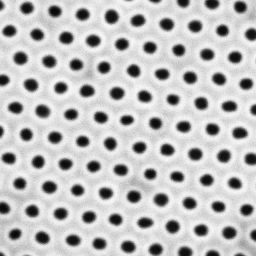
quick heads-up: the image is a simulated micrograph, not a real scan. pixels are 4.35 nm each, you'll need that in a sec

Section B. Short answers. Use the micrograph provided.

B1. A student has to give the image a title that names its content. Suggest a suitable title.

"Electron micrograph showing a regular array of holes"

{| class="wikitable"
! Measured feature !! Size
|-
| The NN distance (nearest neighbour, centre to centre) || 120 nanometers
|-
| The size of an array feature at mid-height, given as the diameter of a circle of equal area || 0.0572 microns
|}